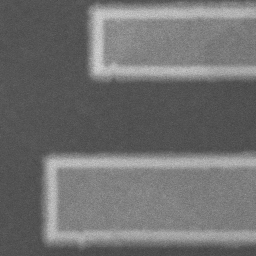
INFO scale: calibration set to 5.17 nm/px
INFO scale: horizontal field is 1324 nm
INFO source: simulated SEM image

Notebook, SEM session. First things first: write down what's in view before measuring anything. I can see one or a few lines or trenches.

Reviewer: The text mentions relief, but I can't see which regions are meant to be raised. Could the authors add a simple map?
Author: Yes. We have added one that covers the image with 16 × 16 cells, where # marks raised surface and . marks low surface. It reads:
................
......##########
......##########
......##########
................
................
................
................
................
................
...#############
...#############
...#############
...#############
...#############
................